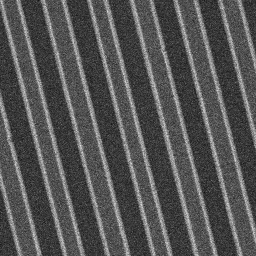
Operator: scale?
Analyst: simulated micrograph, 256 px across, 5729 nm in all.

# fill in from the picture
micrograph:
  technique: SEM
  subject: parallel lines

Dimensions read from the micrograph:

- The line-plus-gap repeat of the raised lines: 956 nm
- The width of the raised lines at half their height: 428 nanometres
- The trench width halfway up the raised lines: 515 nanometres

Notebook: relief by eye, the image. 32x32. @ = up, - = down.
@@---@@@---@@----@@---@@@---@@--
@@@---@@---@@@---@@---@@@---@@--
-@@---@@@---@@---@@@--@@@---@@@-
-@@---@@@---@@---@@@---@@---@@@-
-@@@--@@@---@@----@@---@@@---@@-
-@@@---@@---@@@---@@---@@@---@@-
--@@---@@@---@@---@@----@@---@@@
--@@---@@@---@@---@@@---@@---@@@
--@@----@@---@@----@@---@@@---@@
--@@@---@@---@@@---@@---@@@---@@
---@@---@@@---@@---@@@---@@---@@
---@@---@@@---@@---@@@---@@---@@
---@@----@@---@@----@@---@@@---@
---@@@---@@---@@@---@@---@@@---@
@---@@---@@@---@@---@@@---@@---@
@---@@---@@@---@@---@@@---@@---@
@---@@----@@---@@----@@---@@@---
@---@@@---@@---@@@---@@---@@@---
@@---@@---@@@---@@---@@@---@@---
@@---@@---@@@---@@---@@@---@@---
@@---@@----@@---@@----@@---@@@--
@@---@@@---@@---@@@---@@---@@@--
@@@---@@---@@@---@@---@@@---@@--
@@@---@@---@@@---@@---@@@---@@--
-@@---@@----@@---@@----@@---@@@-
-@@----@@---@@---@@@---@@---@@@-
-@@@---@@---@@@---@@---@@@---@@-
-@@@---@@---@@@---@@---@@@---@@@
--@@---@@----@@---@@----@@---@@@
--@@----@@---@@@--@@@---@@---@@@
--@@@---@@---@@@---@@---@@@---@@
--@@@---@@---@@@---@@---@@@---@@